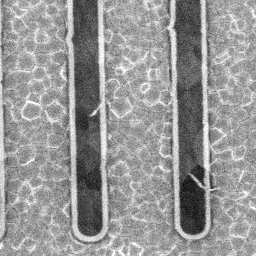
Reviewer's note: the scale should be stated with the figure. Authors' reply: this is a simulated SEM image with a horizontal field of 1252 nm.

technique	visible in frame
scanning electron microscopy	one or a few lines or trenches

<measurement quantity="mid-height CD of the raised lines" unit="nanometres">149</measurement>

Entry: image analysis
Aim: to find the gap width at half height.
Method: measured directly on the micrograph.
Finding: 352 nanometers